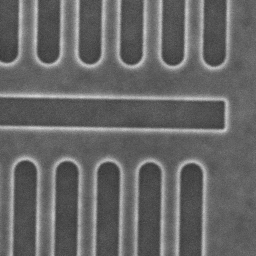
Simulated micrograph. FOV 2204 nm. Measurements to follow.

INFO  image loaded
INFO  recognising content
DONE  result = groups of lines, slits or small figures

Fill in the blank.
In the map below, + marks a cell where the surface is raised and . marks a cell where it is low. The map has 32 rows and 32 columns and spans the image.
...++...++...++...++...++...++++
..+++...++...++...++...++...++++
..+++...++...++...++...++...++++
..++....++...++...++...++...++++
..++....++...++...++...++...++++
..++....++...++...++...++...++++
..++....++...++...++...++...++++
..+++..+++..+++...++...++...++++
++++++++++++++++++++++++++++++++
++++++++++++++++++++++++++++++++
++++++++++++++++++++++++++++++++
++++++++++++++++++++++++++++++++
............................++++
............................++++
............................++++
............................++++
++++++++++++++++++++++++++++++++
++++++++++++++++++++++++++++++++
++++++++++++++++++++++++++++++++
++++++++++++++++++++++++++++++++
++..+++..++++.++++..+++..+++++++
++...++...++...++...+++..+++++++
++...++...++...++...++....++++++
++...++...++...++...++....++++++
++...++...++...++...++...+++++++
++...++...++...++...++...+++++++
++...++...++...++...++...+++++++
++...++...++...++...++...+++++++
+....++...++...++...++...+++++++
+....++...++...++...++...+++++++
+....++...++...++...++...+++++++
+....++...++...++...++...+++++++